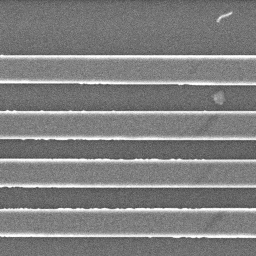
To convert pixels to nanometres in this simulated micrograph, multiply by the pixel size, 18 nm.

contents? lines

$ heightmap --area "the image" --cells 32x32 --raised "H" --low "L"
LLLLLLLLLLLLLLLLLLLLLLLLLLLLLLLL
LLLLLLLLLLLLLLLLLLLLLLLLLLLLLLLL
LLLLLLLLLLLLLLLLLLLLLLLLLLLLLLLL
LLLLLLLLLLLLLLLLLLLLLLLLLLLLLLLL
LLLLLLLLLLLLLLLLLLLLLLLLLLLLLLLL
LLLLLLLLLLLLLLLLLLLLLLLLLLLLLLLL
LLLLLLLLLLLLLLLLLLLLLLLLLLLLLLLL
HHHHHHHHHHHHHHHHHHHHHHHHHHHHHHHH
HHHHHHHHHHHHHHHHHHHHHHHHHHHHHHHH
HHHHHHHHHHHHHHHHHHHHHHHHHHHHHHHH
LLLLLLLLLLLLLLLLLLLLLLLHHHHHHHHH
LLLLLLLLLLLLLLLLLLLLLLLLLLLLLLLL
LLLLLLLLLLLLLLLLLLLLLLLLLLLLLLLL
LLLLLLLLLLLLLLLLLLLLLLLLLLLLLLLL
HHHHHHHHHHHHHHHHHHHHHHHHHHHHHHHH
HHHHHHHHHHHHHHHHHHHHHHHHHHHHHHHH
HHHHHHHHHHHHHHHHHHHHHHHHHHHHHHHH
LLLLLLLLLLLLLLLLLLLLLLLLLLLLLLLL
LLLLLLLLLLLLLLLLLLLLLLLLLLLLLLLL
LLLLLLLLLLLLLLLLLLLLLLLLLLLLLLLL
HHHHHHHHHHHHHHHHHHHHHHHHHHHHHHHH
HHHHHHHHHHHHHHHHHHHHHHHHHHHHHHHH
HHHHHHHHHHHHHHHHHHHHHHHHHHHHHHHH
LLLLLLLLLLLLLLLLLLLLLLLLLLLLLLLL
LLLLLLLLLLLLLLLLLLLLLLLLLLLLLLLL
LLLLLLLLLLLLLLLLLLLLLLLLLLLLLLLL
HHHHHHHHHHHHHHHHHHHHHHHHHHHHHHHH
HHHHHHHHHHHHHHHHHHHHHHHHHHHHHHHH
HHHHHHHHHHHHHHHHHHHHHHHHHHHHHHHH
HHHHHHHHHHHHHHHHHHHHHHHHHHHHHHHH
LLLLLLLLLLLLLLLLLLLLLLLLLLLLLLLL
LLLLLLLLLLLLLLLLLLLLLLLLLLLLLLLL